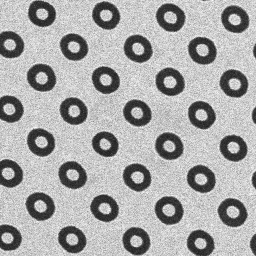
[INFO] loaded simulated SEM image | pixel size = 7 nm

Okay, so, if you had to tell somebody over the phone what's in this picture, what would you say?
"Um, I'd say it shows a regular array of ring-shaped grooves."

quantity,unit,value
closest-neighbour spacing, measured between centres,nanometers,313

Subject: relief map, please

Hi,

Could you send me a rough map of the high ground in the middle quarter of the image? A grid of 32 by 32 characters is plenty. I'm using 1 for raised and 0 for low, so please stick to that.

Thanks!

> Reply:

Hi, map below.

11111111111111111111111111111111
11111111000001111111111100001111
11111110000001111111111000000111
11111110011100111111111001100011
11111110011100111111111001110011
11111110000000111111111001110011
11111111000001111111111100000011
11111111110111111111111110000111
10011111111111111111111111111111
00000111111111110000111111111111
00100011111111100000011111111110
01110011111111100110001111111110
01110011111111100111001111111110
00000011111111100010001111111110
10000111111111110000011111111111
11111111111111111100111111111111
11111111111111111111111111111111
11111111000011111111111100001111
11111110000001111111111000000111
11111110011000111111111001100111
11111110011100111111111001110011
11111110000000111111111001110011
11111111100001111111111100000011
11111111111111111111111110001111
00011111111111111111111111111111
00001111111111110000111111111111
01000111111111100000011111111110
01110011111111100111001111111110
01110011111111100111001111111110
00000011111111100010001111111110
00000111111111110000011111111110
11111111111111111000111111111111